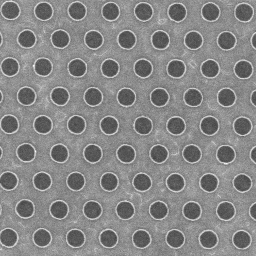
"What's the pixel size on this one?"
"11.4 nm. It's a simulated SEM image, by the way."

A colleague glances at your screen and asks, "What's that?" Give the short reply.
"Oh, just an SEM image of a regular array of raised bodies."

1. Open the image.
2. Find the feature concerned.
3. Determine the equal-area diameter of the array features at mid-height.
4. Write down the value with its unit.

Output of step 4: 216 nm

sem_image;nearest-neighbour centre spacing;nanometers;371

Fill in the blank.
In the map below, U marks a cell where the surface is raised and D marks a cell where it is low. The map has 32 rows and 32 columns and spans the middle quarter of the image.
DUUUUDDDDUUUUUDDDUUUUUDDDDUUUUDD
DUUUUUDDDUUUUUDDDUUUUUDDDDUUUUDD
DUUUUDDDDDUUUDDDDDUUUUDDDDUUUUDD
DDDDDDDDDDDDDDDDDDDDDDDDDDDDDDDD
DDDDDDDDDDDDDDDDDDDDDDDDDDDDDDDD
DDDDDDDDDDDDDDDDDDDDDDDDDDDDDDDD
UDDDDDUUUDDDDDUUUDDDDDUUUDDDDDDU
UDDDDUUUUDDDDUUUUUDDDDUUUUDDDDUU
UDDDDUUUUUDDDUUUUUDDDDUUUUDDDDUU
UDDDDDUUUDDDDDUUUUDDDDUUUUDDDDUU
DDDDDDDDDDDDDDDUUDDDDDDUUDDDDDDD
DDDDDDDDDDDDDDDDDDDDDDDDDDDDDDDD
DDDDDDDDDDDDDDDDDDDDDDDDDDDDDDDD
DDUUUDDDDDUUUDDDDDUUUDDDDDDUUDDD
DUUUUDDDDUUUUDDDDDUUUUDDDDUUUUDD
DUUUUDDDDUUUUDDDDDUUUUDDDDUUUUDD
DUUUUDDDDUUUUDDDDDUUUUDDDDUUUUDD
DDDDDDDDDDUUDDDDDDDUUDDDDDDUUDDD
DDDDDDDDDDDDDDDDDDDDDDDDDDDDDDDD
DDDDDDDDDDDDDDDDDDDDDDDDDDDDDDDD
DDDDDDUUDDDDDDUUUDDDDDUUUDDDDDUU
UDDDDUUUUDDDDUUUUUDDDDUUUUDDDDUU
UDDDDUUUUDDDDUUUUUDDDUUUUUDDDDUU
UDDDDUUUUDDDDDUUUUDDDDUUUUDDDDUU
DDDDDDUUDDDDDDUUUDDDDDDUUDDDDDDU
DDDDDDDDDDDDDDDDDDDDDDDDDDDDDDDD
DDDDDDDDDDDDDDDDDDDDDDDDDDDDDDDD
DDUUDDDDDDUUUDDDDDDUDDDDDDDUUDDD
DUUUUDDDDUUUUDDDDDUUUDDDDDUUUUDD
DUUUUDDDDUUUUUDDDUUUUUDDDDUUUUDD
DUUUUDDDDUUUUDDDDUUUUUDDDDUUUUDD
DDUUDDDDDDUUUDDDDDUUUDDDDDDUUUDD